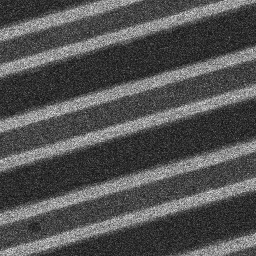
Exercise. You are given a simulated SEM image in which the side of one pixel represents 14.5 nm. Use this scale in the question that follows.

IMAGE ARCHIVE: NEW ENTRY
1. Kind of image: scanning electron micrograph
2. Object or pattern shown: one or a few lines or trenches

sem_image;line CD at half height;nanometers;524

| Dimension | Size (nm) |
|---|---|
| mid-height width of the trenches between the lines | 767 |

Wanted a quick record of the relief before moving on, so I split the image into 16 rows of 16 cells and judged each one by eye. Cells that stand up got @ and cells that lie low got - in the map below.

------@@@@@@@---
--@@@@@@@@------
@@@@@@@---------
@@@------------@
------------@@@@
--------@@@@@@@@
-----@@@@@@@@---
-@@@@@@@@@------
@@@@@@----------
@@@------------@
-----------@@@@@
--------@@@@@@@@
----@@@@@@@@----
-@@@@@@@@-------
@@@@@-----------
@@------------@@